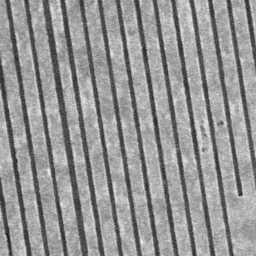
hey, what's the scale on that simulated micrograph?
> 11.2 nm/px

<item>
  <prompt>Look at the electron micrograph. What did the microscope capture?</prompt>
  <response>parallel lines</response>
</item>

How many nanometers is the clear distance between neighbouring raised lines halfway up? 61.1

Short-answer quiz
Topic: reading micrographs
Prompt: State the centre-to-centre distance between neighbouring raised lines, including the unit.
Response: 0.204 microns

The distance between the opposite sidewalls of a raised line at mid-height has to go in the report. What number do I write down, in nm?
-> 144